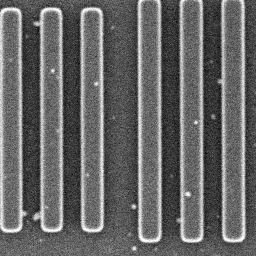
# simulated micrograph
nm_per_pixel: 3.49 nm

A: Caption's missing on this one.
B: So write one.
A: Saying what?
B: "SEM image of groups of lines, slits or small figures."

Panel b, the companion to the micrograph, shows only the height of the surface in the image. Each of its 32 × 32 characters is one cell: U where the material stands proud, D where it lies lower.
DDDDDDDDDDDDDDDDDUUUDDDUUDDDUUDD
UUDDDUUUDDUUUDDDDUUUDDDUUDDDUUDD
UUUDDUUUDDUUUDDDDUUUDDDUUDDDUUDD
UUUDDUUUDDUUUDDDDUUUDDDUUDDDUUDD
UUUDDUUUDDUUUDDDDUUUDDDUUDDDUUDD
UUUDDUUUDDUUUDDDDUUUDDDUUDDDUUDD
UUUDDUUUDDUUUDDDDUUUDDDUUDDDUUDD
UUUDDUUUDDUUUDDDDUUUDDDUUDDDUUDD
UUUDDUUUDDUUUDDDDUUUDDDUUDDDUUDD
UUUDDUUUDDUUUDDDDUUUDDDUUDDDUUDD
UUUDDUUUDDUUUDDDDUUUDDDUUDDDUUDD
UUUDDUUUDDUUUDDDDUUUDDDUUDDDUUDD
UUUDDUUUDDUUUDDDDUUUDDDUUDDDUUDD
UUUDDUUUDDUUUDDDDUUUDDDUUDDDUUDD
UUUDDUUUDDUUUDDDDUUUDDDUUDDDUUDD
UUUDDUUUDDUUUDDDDUUUDDDUUDDDUUUD
UUUDDUUUDDUUUDDDDUUUDDDUUDDDUUUD
UUUDDUUUDDUUUDDDDUUUDDDUUDDDUUUD
UUUDDUUUDDUUUDDDDUUUDDDUUDDDUUUD
UUUDDUUUDDUUUDDDDUUUDDDUUDDDUUUD
UUUDDUUUDDUUUDDDDUUUDDDUUDDDUUUD
UUUDDUUUDDUUUDDDDUUUDDDUUDDDUUUD
UUUDDUUUDDUUUDDDDUUUDDDUUDDDUUUD
UUUDDUUUDDUUUDDDDUUUDDDUUDDDUUUD
UUUDDUUUDDUUUDDDDUUUDDDUUDDDUUUD
UUUDDUUUDDUUUDDDDUUUDDDUUDDDUUUD
UUUDDUUUDDUUUDDDDUUUDDDUUDDDUUUD
UUUDDUUUDDUUUDDDDUUUDDDUUDDDUUUD
UUUDDUUUDDUUUDDDDUUUDDDUUDDDUUUD
DDDDDDDDDDDDDDDDDUUUDDDUUDDDUUUD
DDDDDDDDDDDDDDDDDDDDDDDDDDDDDDDD
DDDDDDDDDDDDDDDDDDDDDDDDDDDDDDDD